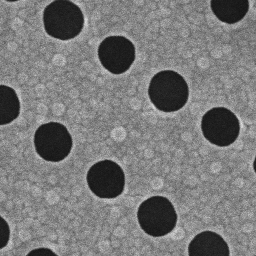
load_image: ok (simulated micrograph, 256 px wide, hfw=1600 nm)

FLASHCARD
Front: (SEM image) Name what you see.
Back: holes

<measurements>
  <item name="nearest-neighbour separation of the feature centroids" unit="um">0.393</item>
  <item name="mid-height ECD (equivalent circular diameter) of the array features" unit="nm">244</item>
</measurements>